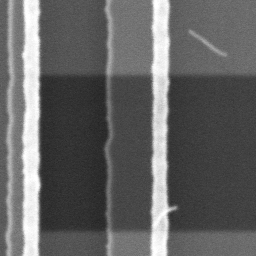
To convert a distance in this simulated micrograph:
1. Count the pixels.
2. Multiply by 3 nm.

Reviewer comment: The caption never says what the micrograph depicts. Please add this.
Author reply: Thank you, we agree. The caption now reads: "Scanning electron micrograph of lines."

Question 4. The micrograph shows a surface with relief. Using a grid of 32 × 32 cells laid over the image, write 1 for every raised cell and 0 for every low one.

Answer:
01111000000001111111100000000000
01111000000001111111100000000000
01111000000000111111100000000000
01111000000000111111100000000000
01111000000000111111100000000000
01111000000001111111100000000000
01111000000000111111100000000000
01111000000000111111100000000000
01111000000001111111100000000000
01111000000001111111100000000000
01111000000001111111100000000000
01111000000001111111100000000000
01111000000001111111100000000000
01111000000001111111100000000000
01111000000001111111100000000000
01111000000000111111100000000000
01111000000000111111100000000000
01111000000000111111100000000000
01111000000001111111100000000000
01111000000001111111100000000000
01111000000001111111100000000000
01111000000000111111100000000000
01111000000000111111100000000000
01111000000001111111100000000000
01111000000001111111100000000000
01111000000001111111100000000000
01111000000001111111100000000000
01111000000001111111100000000000
01111000000001111111100000000000
01111000000000111111100000000000
01111000000001111111100000000000
01111000000001111111100000000000